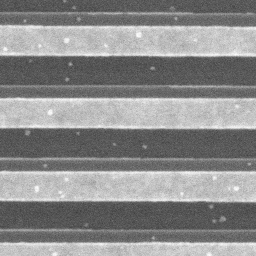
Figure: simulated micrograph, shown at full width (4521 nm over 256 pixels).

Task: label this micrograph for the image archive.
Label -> lines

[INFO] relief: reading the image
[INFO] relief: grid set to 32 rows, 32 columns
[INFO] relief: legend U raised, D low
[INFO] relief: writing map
DDDDDDDDDDDDDDDDDDDDDDDDDDDDDDDD
DDDDDDDDDDDDDDDDDDDDDDDDDDDDDDDD
DDDDDDDDDDDDDDDDDDDDDDDDDDDDDDDD
UUUUUUUUUUUUUUUUUUUUUUUUUUUUUUUU
UUUUUUUUUUUUUUUUUUUUUUUUUUUUUUUU
UUUUUUUUUUUUUUUUUUUUUUUUUUUUUUUU
UUUUUUUUUUUUUUUUUUUUUUUUUUUUUUUU
DDDDDDDDDDDDDDDDDDDDDDDDDDDDDDDD
DDDDDDDDDDDDDDDDDDDDDDDDDDDDDDDD
DDDDDDDDDDDDDDDDDDDDDDDDDDDDDDDD
DDDDDDDDDDDDDDDDDDDDDDDDDDDDDDDD
DDDDDDDDDDDDDDDDDDDDDDDDDDDDDDDD
UUUUUUUUUUUUUUUUUUUUUUUUUUUUUUUU
UUUUUUUUUUUUUUUUUUUUUUUUUUUUUUUU
UUUUUUUUUUUUUUUUUUUUUUUUUUUUUUUU
UUUUUUUUUUUUUUUUUUUUUUUUUUUUUUUU
DDDDDDDDDDDDDDDDDDDDDDDDDDDDDDDD
DDDDDDDDDDDDDDDDDDDDDDDDDDDDDDDD
DDDDDDDDDDDDDDDDDDDDDDDDDDDDDDDD
DDDDDDDDDDDDDDDDDDDDDDDDDDDDDDDD
DDDDDDDDDDDDDDDDDDDDDDDDDDDDDDDD
UDDDDDDDDDDDDDDDDDDDDDDDDDDDDDDD
UUUUUUUUUUUUUUUUUUUUUUUUUUUUUUUU
UUUUUUUUUUUUUUUUUUUUUUUUUUUUUUUU
UUUUUUUUUUUUUUUUUUUUUUUUUUUUUUUU
DDDDDDDDDDDDDDDDDDDDDDDDDDDDDDDD
DDDDDDDDDDDDDDDDDDDDDDDDDDDDDDDD
DDDDDDDDDDDDDDDDDDDDDDDDDDDDDDDD
DDDDDDDDDDDDDDDDDDDDDDDDDDDDDDDD
DDDDDDDDDDDDDDDDDDDDDDDDDDDDDDDD
UUUUUUUUUUUUUUUUUUUUUUUUUUUUUUUU
UUUUUUUUUUUUUUUUUUUUUUUUUUUUUUUU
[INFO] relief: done